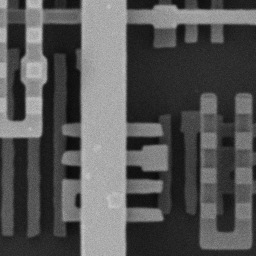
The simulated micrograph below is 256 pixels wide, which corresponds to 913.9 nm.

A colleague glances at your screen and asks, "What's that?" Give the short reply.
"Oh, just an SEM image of wiring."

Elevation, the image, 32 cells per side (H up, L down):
HLLHHLLLLLHHHHHHLLLLLLLLLLLLLLLL
HHHHHHHHHHHHHHHHHHHHHHHHHHHHHHHH
HHHHHHHHHHHHHHHHHHHHHHHHHHHHHHHH
HLLHHLLLLLHHHHHHLLLLLLLLLLLLLLLL
HLLHHLLLLLHHHHHHLLLLLLLLLLLLLLLL
HLLHHLLLLLHHHHHHLLLLLLLLLLLLLLLL
HLLHHLLLLLHHHHHHLLLLLLLLLLLLLLLL
HLLHHHLLLLHHHHHHLLLLLLLLLLLLLLLL
HLLHHHLLLLHHHHHHLLLLLLLLLLLLLLLL
HLLHHHLLLLHHHHHHLLLLLLLLLLLLLLLL
HLLHHHLLLLHHHHHHLLLLLLLLLLLLLLLL
HLLHHLLLLLHHHHHHLLLLLLLLLLLLLLLL
HLLHHLLLLLHHHHHHLLLLLLLLLHHLLHHL
HLLHHLLLLLHHHHHHLLLLLLLLLHHLLHHL
HLLHHLLLLLHHHHHHLLLLLLLLLHHLLHHL
HHHHHLLLLHHHHHHHLHHLLLLLLHHHLHHH
HHHHHLLLHHHHHHHHHHHHLLLLLHHHHHHH
LLLLLLLLLLHHHHHHLLLLLLLLLHHLLHHH
LLLLLLLLLLHHHHHHLLHHHLLLLHHHHHHH
LLLLLLLLHHHHHHHHHHHHHLLLLHHHHHHH
LLLLLLLLHHHHHHHHHHHHHLLLLHHHHHHH
LLLLLLLLLLHHHHHHLLLLLLLLLHHHHHHH
LLLLLLLLHHHHHHHHHHHLLLLLLHHHHHHH
LLLLLLLLHHHHHHHHHHHHLLLLLHHHHHHH
LLLLLLLLHHHHHHHHLLLLLLLLLHHLLHHH
LLLLLLLLHLHHHHHHLLLLLLLLLHHLLHHL
LLLLLLLLHHHHHHHHHHHHLLLLLHHLLHHL
LLLLLLLLHHHHHHHHHHHHLLLLLHHLLHHL
LLLLLLLLLLHHHHHHLLLLLLLLLHHLLHHL
LLLLLLLLLLHHHHHHLLLLLLLLLHHHHHHL
LLLLLLLLLLHHHHHHLLLLLLLLLHHHHHHL
LLLLLLLLLLHHHHHHLLLLLLLLLLLLLLLL